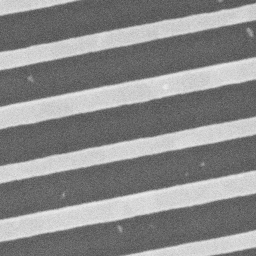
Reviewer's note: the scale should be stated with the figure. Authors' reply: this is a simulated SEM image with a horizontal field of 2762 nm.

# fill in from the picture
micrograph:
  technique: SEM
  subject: lines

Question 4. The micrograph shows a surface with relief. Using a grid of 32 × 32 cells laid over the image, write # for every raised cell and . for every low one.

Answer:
########........................
##.........................#####
.....................###########
................###########.....
...........##########...........
......###########...............
.##########.....................
######........................##
#........................#######
....................############
...............##############...
..........##############........
....###############.............
#############...................
########........................
###........................#####
......................##########
.................###########....
...........############.........
.......###########..............
.###########....................
#######........................#
##........................######
.....................###########
................##############..
...........##############.......
.....##############.............
###############.................
#########.......................
####.........................###
........................########
..................###########...